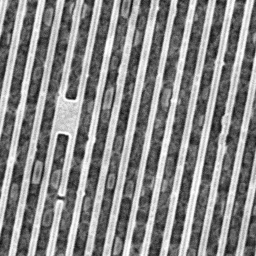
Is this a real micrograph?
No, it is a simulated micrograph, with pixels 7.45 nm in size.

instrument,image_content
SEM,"parallel lines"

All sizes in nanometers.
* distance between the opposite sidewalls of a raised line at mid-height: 42.1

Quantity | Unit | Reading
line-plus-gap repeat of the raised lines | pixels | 18.6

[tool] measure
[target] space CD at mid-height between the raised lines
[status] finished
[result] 97.9 nanometers